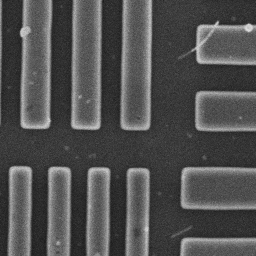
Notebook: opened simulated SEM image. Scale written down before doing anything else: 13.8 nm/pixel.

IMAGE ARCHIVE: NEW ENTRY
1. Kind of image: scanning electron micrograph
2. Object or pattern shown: groups of lines, slits or small figures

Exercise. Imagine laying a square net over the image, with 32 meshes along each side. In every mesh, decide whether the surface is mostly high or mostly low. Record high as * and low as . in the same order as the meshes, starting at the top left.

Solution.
...***...****...***.............
...***...****...***.............
...***...****..****.............
...***...****..****......*******
...***...****..****......*******
...***...****..****......*******
...***...****..****......*******
...***...****..****......*******
...***...****..****.............
...***...***...****.............
...***...***...****.............
...***...***...****.............
...***...***...****......*******
...***...***...****......*******
...***...***...****......*******
...***...***...****......*******
................................
................................
................................
................................
................................
.***..***..***..**.....*********
.***..***..***..***....*********
.***..***..***..***....*********
.***..***..***..***....*********
.***..***..***..***....*********
.***..***..***..***.............
.***..***..***..**..............
.***..***..***..***.............
.***..***..***..**..............
.***..***..**...**.....*********
.***..***..**...**.....*********